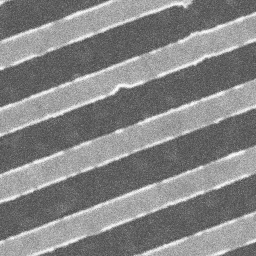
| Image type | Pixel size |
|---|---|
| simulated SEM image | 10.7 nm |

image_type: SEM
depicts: one or a few lines or trenches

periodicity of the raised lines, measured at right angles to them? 669 nm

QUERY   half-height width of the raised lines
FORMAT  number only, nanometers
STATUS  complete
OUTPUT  281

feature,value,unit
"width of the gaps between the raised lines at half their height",0.388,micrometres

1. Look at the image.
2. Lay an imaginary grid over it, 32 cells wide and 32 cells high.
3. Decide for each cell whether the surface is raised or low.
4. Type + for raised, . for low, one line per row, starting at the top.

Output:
.............+++++++++++........
..........++++++++++............
.......++++++++++.............++
.....+++++++++.............+++++
..+++++++++.............++++++++
+++++++++............++++++++++.
++++++.............+++++++++....
+++.............+++++++++.......
+.............+++++++++.........
...........+++++++++............
........++++++++++.............+
.....+++++++++..............++++
...+++++++++.............+++++++
++++++++++............++++++++++
+++++++............++++++++++...
++++.............+++++++++......
+.............++++++++++........
............+++++++++...........
.........+++++++++.............+
......++++++++++............++++
....+++++++++.............++++++
.+++++++++.............+++++++++
++++++++.............+++++++++..
+++++.............+++++++++.....
++.............+++++++++........
.............+++++++++.........+
..........+++++++++.............
.......+++++++++.............+++
.....+++++++++.............+++++
..+++++++++.............++++++++
+++++++++............++++++++++.
++++++............++++++++++....